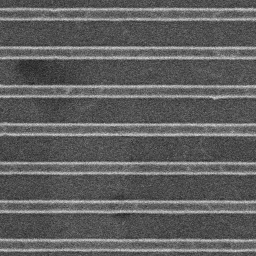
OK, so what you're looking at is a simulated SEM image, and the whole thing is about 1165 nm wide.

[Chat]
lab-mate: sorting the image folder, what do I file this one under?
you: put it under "parallel lines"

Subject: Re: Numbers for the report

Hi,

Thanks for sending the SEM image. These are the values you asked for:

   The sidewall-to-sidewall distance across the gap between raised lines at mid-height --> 127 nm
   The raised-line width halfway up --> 49.4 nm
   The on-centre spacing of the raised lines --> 175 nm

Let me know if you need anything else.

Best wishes